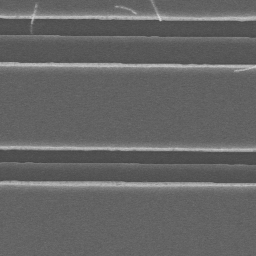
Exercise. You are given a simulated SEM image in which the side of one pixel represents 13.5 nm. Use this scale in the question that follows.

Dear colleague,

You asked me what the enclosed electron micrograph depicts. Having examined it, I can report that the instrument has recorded lines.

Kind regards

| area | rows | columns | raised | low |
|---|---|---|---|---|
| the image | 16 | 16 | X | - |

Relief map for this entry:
XXXXXXXXXXXXXXXX
----------------
----------------
----------------
XXXXXXXXXXXXXXXX
XXXXXXXXXXXXXXXX
XXXXXXXXXXXXXXXX
XXXXXXXXXXXXXXXX
XXXXXXXXXXXXXXXX
----------------
----------------
XXXXXXXXXXXXXXX-
XXXXXXXXXXXXXXXX
XXXXXXXXXXXXXXXX
XXXXXXXXXXXXXXXX
XXXXXXXXXXXXXXXX